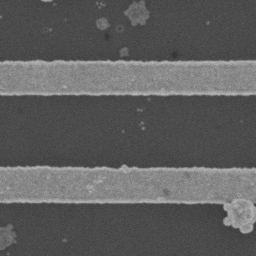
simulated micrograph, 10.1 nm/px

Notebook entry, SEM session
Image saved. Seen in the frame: lines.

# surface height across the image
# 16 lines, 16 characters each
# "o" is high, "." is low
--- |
................
................
................
................
oooooooooooooooo
oooooooooooooooo
................
................
................
................
ooooo..o........
oooooooooooooooo
oooooooooooooooo
..............oo
................
................